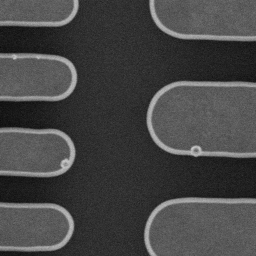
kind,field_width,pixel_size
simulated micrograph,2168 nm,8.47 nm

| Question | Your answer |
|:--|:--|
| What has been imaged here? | groups of lines, slits or small figures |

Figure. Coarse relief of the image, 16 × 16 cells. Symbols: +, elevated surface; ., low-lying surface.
+++++.....++++++
.+++......++++++
................
+++.............
+++++...........
++++......++++++
..........++++++
.........+++++++
++++......++++++
+++++......+++++
++++............
................
................
++++......++++++
++++.....+++++++
+++......+++++++